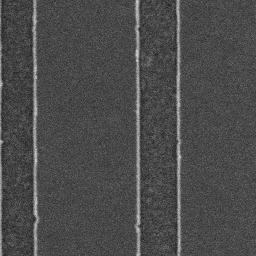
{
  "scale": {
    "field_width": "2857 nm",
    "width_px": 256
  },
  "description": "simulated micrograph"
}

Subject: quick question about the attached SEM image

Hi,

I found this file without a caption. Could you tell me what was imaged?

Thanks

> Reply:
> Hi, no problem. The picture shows one or a few lines or trenches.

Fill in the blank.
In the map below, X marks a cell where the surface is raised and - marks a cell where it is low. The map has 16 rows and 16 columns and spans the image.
--XXXXXXX--XXXXX
--XXXXXXX--XXXXX
--XXXXXXX--XXXXX
--XXXXXXX--XXXXX
--XXXXXXX--XXXXX
--XXXXXXX--XXXXX
--XXXXXXX--XXXXX
--XXXXXXX--XXXXX
--XXXXXXX--XXXXX
--XXXXXXX--XXXXX
--XXXXXXX--XXXXX
--XXXXXXX--XXXXX
--XXXXXXX--XXXXX
--XXXXXXX--XXXXX
--XXXXXXX--XXXXX
--XXXXXXX--XXXXX